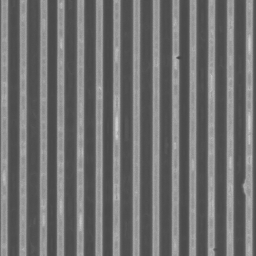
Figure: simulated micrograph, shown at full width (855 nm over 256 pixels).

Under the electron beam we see parallel lines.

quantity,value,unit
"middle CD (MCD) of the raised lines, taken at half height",27.1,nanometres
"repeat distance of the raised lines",62.9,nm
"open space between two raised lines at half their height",0.0359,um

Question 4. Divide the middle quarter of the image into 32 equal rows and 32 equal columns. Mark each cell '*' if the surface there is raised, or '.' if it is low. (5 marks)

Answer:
...**...**..**...**...**...**..*
...**...**..**...**...**...**..*
...**...**..**...**...**...**..*
...**...**..**...**...**...**..*
...**...**..**...**...**...**..*
...**...**..**...**...**...**..*
...**...**..**...**...**...**..*
...**...**..**...**...**...**..*
...**...**..**...**...**...**..*
...**...**..**...**...**...**..*
...**...**..**...**...**...**..*
...**...**..**...**...**...**..*
...**...**..**...**...**...**..*
...**...**..**...**...**...**..*
...**...**..**...**...**...**..*
...**...**..**...**...**...**..*
...**...**..**...**...**...**..*
...**...**..**...**...**...**..*
...**...**..**...**...**...**..*
...**...**..**...**...**...**..*
...**...**..**...**...**...**..*
...**...**..**...**...**...**..*
...**...**..**...**...**...**..*
...**...**..**...**...**...**..*
...**...**..**...**...**...**..*
...**...**..**...**...**...**..*
...**...**..**...**...**...**..*
...**...**..**...**...**...**..*
...**...**..**...**...**...**..*
...**...**..**...**...**...**..*
...**...**..**...**...**...**..*
...**...**..**...**...**...**..*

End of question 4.